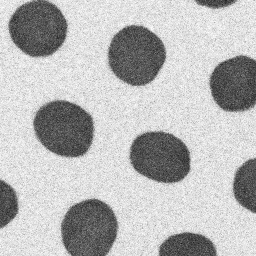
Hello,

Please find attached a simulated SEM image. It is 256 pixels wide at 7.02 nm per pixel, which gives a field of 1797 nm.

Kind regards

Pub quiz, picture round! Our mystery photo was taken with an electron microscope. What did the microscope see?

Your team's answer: holes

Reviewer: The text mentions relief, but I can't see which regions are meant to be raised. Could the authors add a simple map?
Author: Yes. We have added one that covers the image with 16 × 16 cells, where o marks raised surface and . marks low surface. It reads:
o...oooooooooooo
o...oooooooooooo
o...ooo...oooooo
oo.oooo...oooooo
ooooooo...ooo...
ooooooooooooo...
ooo..ooooooooo..
oo....oooooooooo
oo....ooo..ooooo
ooo..ooo....oooo
oooooooo....ooo.
ooooooooooooooo.
.oooo.ooooooooo.
.ooo...ooooooooo
oooo...ooooooooo
oooo...ooo...ooo